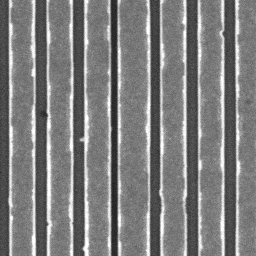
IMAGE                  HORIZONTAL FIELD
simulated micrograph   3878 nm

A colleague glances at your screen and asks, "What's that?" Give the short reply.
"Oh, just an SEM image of parallel lines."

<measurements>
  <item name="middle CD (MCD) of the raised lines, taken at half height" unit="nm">373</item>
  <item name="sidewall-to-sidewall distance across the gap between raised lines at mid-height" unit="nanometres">188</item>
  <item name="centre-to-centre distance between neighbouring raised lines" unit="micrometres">0.573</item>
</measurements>